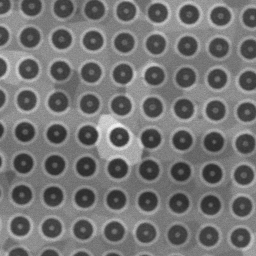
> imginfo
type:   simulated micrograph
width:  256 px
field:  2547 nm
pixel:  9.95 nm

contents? an array of small figures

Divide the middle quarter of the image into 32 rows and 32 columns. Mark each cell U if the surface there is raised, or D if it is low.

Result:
DDUUUDDDDUUUUDDDDUUUUDDDUUUUUUUU
DDUUDDDDDDUUDDDDDUUUDDDDDUUUDDDD
DDUUDDDDDDUUDDDDDDUUDDDDDUUUDDDD
DUUUDDDDDUUUDDDDDUUUDDDDDUUDDDUD
UUUUUDDDUUUUUDDDDUUUDDDDDUUUDDDD
UUUUUUUUUUUUUUUUUUUUUUDDUUUUDDDD
UUUUUUUUUUUUUUUUUUUUUUUUUUUUUUUU
UUUUUDDDUUUUUUUUUUUUUUUUUUUUUUUU
DUUUDDDDDUUUDDDDUUUUUDDDUUUUUDDU
DUUUDDDDDUUUDDDDDUUUDDDDDUUUDDDD
DUUUDDDDDUUDDDDDDUUDDDDDDUUDDDDD
DUUUDDDDDUUUDDDDDUUUDDDDDUUDDDDD
UUUUUDDDUUUUUDDDUUUUDDDDDUUDDDDD
UUUUUUUUUUUUUUUUUUUUUDDUUUUUDDDD
UUUUUUUUUUUUUUUUUUUUUUUUUUUUUUUU
UUUUDDDDUUUUUDUUUUUUUUUUUUUUUUUU
DUUUDDDDDUUUDDDDUUUUDDDDUUUUDDDU
DUUDDDDDDUUDDDDDDUUDDDDDUUUDDDDD
DUUDDDDDDUUDDDDDDUUDDDDDDUUDDDDD
UUUUDDDDUUUDDDDDUUUDDDDDDUUDDDDD
UUUUUDDUUUUUDDDDUUUUDDDDUUUDDDDD
UUUUUUUUUUUUUUUUUUUUUUUUUUUUDDDU
UUUUUUUUUUUUUUUUUUUUUUUUUUUUUUUU
UUUUDDDUUUUUDDDUUUUUUUUUUUUUUUUU
DUUDDDDDUUUDDDDDUUUDDDDUUUUUDDDU
DUUDDDDDUUUDDDDDUUUDDDDDUUUDDDDD
UUUDDDDDUUUDDUDDUUDDDDDDUUDDDDDD
UUUDDDDDUUUDDDDDUUUDDDDDUUDDDDDD
UUUUUUUUUUUUDDDUUUUDDDDUUUUDDDDD
UUUUUUUUUUUUUUUUUUUUUDUUUUUUDDUU
UUUUUUUUUUUUUUUUUUUUUUUUUUUUUUUU
UUUDDDDUUUUUDDUUUUUUUDUUUUUUUUUU